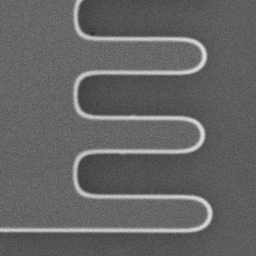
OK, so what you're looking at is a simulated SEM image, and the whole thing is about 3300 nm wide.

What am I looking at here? groups of lines, slits or small figures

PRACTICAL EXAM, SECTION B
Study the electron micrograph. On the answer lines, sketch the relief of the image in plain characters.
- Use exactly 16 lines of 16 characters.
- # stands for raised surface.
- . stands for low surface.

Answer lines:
#####...........
#####...........
############....
#############...
############....
#####...........
#####...........
############....
#############...
######..........
#####...........
#####...........
#############...
#############...
................
................